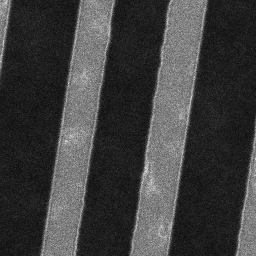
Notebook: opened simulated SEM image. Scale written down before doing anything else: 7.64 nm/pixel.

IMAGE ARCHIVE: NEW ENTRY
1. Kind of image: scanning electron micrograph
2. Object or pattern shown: one or a few lines or trenches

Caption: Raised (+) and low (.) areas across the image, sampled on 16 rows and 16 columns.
.++++..++++..+++
+++++..+++...+++
+++++..+++..++++
+++++..+++..++++
++++..++++..++++
++++..++++..++++
++++..++++..++++
++++..++++..++++
++++..+++...++++
++++..+++..+++++
++++.++++..+++++
+++..++++..+++++
+++..++++..++++.
+++..++++..++++.
+++..+++...++++.
+++..+++..+++++.